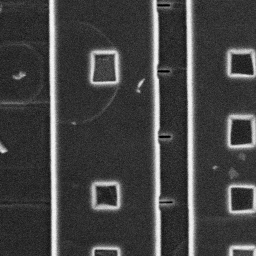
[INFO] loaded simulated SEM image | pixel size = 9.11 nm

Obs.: wiring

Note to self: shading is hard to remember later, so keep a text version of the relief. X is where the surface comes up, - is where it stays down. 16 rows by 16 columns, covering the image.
---XXXXXXX--XXXX
---XXXXXXX--XXXX
---XXXXXXX--XXXX
---XXXXXXX--XXXX
---XXXXXXX--XXXX
---XXXXXXX--XXXX
---XXXXXXX--XXXX
---XXXXXXX--XXXX
---XXXXXXX--XXXX
---XXXXXXX--XXXX
---XXXXXXX--XXXX
---XXXXXXX--XXXX
---XXX-XXX--XXXX
---XXXXXXX--XXXX
---XXXXXXX--XXXX
---XXXXXXX--XXXX